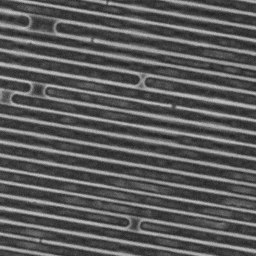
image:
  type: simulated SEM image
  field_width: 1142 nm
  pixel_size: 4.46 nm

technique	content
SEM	parallel lines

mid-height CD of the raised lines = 2.83 px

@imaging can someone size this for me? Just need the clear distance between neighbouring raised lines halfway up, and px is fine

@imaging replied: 10.2